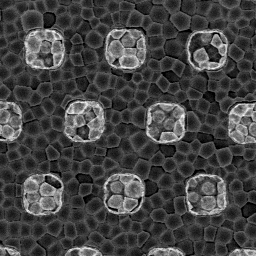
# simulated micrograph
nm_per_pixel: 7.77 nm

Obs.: raised bodies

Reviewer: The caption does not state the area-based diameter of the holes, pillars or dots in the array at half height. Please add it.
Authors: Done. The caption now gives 287 nanometres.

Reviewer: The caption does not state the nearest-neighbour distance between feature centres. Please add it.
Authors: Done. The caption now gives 0.654 micrometres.